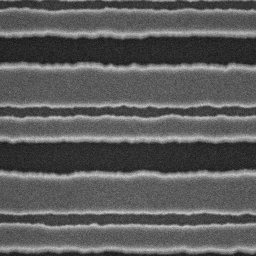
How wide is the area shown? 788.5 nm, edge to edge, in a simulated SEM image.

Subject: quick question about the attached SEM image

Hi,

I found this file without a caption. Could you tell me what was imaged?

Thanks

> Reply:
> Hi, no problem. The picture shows lines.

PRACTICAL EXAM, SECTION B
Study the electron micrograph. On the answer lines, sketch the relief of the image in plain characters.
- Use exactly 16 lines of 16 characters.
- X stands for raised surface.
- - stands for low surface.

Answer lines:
XXXXXXXXXXXXXXXX
XXXXXXXXXXXXXXXX
----------------
----------------
XXXXXXXXXXXXXXXX
XXXXXXXXXXXXXXXX
XXXXXXXXXXXXXXXX
XXXXXXXXXXXXXXXX
XXXXXXXXXXXXXXXX
----------------
----------------
XXXXXXXXXXXXXXXX
XXXXXXXXXXXXXXXX
XXXXXXXXXXXXXXXX
XXXXXXXXXXXXXXXX
XXXXXXXXXXXXXXXX